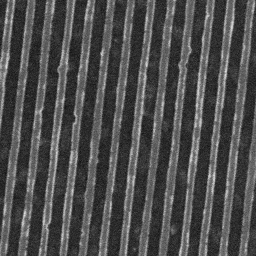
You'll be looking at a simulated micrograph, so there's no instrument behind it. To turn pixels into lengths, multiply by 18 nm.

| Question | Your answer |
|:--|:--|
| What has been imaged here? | parallel lines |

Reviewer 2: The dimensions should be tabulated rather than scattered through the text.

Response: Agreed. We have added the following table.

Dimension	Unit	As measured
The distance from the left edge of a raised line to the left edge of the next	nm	358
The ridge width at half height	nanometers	123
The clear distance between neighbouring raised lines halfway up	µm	0.246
